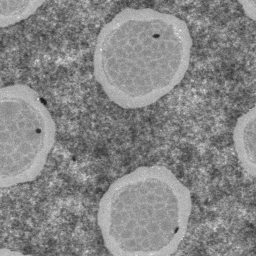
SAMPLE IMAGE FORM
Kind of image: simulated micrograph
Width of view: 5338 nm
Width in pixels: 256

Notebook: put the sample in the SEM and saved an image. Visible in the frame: raised bodies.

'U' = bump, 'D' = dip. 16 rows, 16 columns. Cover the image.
UUDDDDDDDDDDDDDU
DDDDDDDUUUUDDDDD
DDDDDDUUUUUUDDDD
DDDDDDUUUUUUDDDD
DDDDDDUUUUUDDDDD
DDDDDDDUUUUDDDDD
UUDDDDDDDDDDDDDD
UUUDDDDDDDDDDDDU
UUUDDDDDDDDDDDDU
UUUDDDDDDDDDDDDU
UUDDDDDDDDDDDDDD
DDDDDDDUUUUDDDDD
DDDDDDDUUUUUDDDD
DDDDDDUUUUUDDDDD
DDDDDDDUUUUDDDDD
DDDDDDDUUUUDDDDD